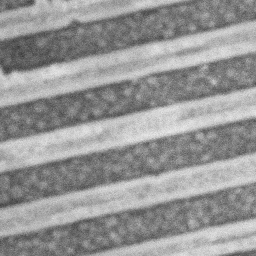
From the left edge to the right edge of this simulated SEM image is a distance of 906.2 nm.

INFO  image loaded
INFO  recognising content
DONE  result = one or a few lines or trenches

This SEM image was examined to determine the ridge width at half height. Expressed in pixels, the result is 21.2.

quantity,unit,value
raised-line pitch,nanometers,227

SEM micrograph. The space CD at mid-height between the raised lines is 153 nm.